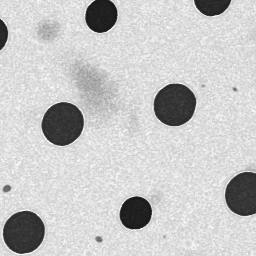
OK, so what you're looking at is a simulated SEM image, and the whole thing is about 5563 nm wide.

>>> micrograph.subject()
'holes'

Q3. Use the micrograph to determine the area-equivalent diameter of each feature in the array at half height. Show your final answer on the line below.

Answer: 42.5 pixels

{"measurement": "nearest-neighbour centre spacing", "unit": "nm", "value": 2470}